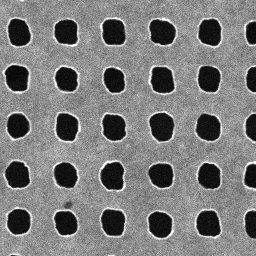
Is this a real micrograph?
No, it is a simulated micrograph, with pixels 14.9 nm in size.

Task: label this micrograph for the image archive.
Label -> a regular array of holes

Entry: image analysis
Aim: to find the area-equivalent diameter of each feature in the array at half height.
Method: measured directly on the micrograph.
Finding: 378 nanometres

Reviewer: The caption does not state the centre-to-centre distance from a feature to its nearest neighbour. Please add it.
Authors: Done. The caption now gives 702 nanometers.